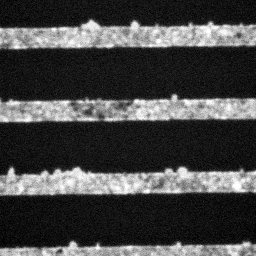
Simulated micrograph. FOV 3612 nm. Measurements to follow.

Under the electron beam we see lines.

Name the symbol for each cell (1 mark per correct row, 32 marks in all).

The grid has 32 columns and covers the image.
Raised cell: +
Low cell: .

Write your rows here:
................................
................................
................................
...........+++++++++++++++++++++
++++++++++++++++++++++++++++++++
++++++++++++++++++++++++++++++++
................................
................................
................................
................................
................................
................................
.....................+....++++++
++++++++++++++++++++++++++++++++
++++++++++++++++++++++++++++++++
................................
................................
................................
................................
................................
................................
.+.......+............++........
++++++++++++++++++++++++++++++++
++++++++++++++++++++++++++++++++
................................
................................
................................
................................
................................
................................
................................
++++++++++++++++++++++++++++++++